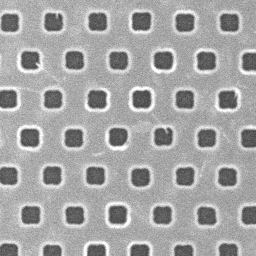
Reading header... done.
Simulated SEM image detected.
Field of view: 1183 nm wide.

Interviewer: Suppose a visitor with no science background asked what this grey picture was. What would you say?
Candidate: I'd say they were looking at a regular array of holes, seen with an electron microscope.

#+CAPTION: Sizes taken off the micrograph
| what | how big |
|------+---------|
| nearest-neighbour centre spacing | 200 nm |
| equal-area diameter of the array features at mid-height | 20.7 px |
